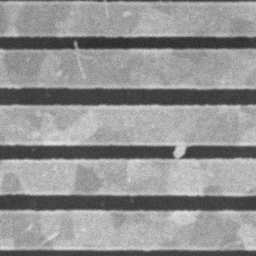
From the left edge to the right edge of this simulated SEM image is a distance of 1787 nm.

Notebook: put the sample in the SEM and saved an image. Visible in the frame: lines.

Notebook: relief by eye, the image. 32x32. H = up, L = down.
HHHHHHHHHHHHHHHHHHHHHHHHHHHHHHHH
HHHHHHHHHHHHHHHHHHHHHHHHHHHHHHHH
HHHHHHHHHHHHHHHHHHHHHHHHHHHHHHHH
HHHHHHHHHHHHHHHHHHHHHHHHHHHHHHHH
LLLLLLLLLLLLLLLLLLLLLLLLLLLLLLLL
LLLLLLLLLLLLLLLLLLLLLLLLLLLLLLLL
HHHHHHHHHHHHHHHHHHHHHHHHHHHHHHHH
HHHHHHHHHHHHHHHHHHHHHHHHHHHHHHHH
HHHHHHHHHHHHHHHHHHHHHHHHHHHHHHHH
HHHHHHHHHHHHHHHHHHHHHHHHHHHHHHHH
HHHHHHHHHHHHHHHHHHHHHHHHHHHHHHHH
LLLLLLLLLLLLLLLLLLLLLLLLLLLLLLLL
LLLLLLLLLLLLLLLLLLLLLLLLLLLLLLLL
HHHHHHHHHHHHHHHHHHHHHHHHHHHHHHHH
HHHHHHHHHHHHHHHHHHHHHHHHHHHHHHHH
HHHHHHHHHHHHHHHHHHHHHHHHHHHHHHHH
HHHHHHHHHHHHHHHHHHHHHHHHHHHHHHHH
HHHHHHHHHHHHHHHHHHHHHHHHHHHHHHHH
LLLLLLLLLLLLLLLLLLLLLLHLLLLLLLLL
LLLLLLLLLLLLLLLLLLLLLLLLLLLLLLLL
HHHHHHHHHHHHHHHHHHHHHHHHHHHHHHHH
HHHHHHHHHHHHHHHHHHHHHHHHHHHHHHHH
HHHHHHHHHHHHHHHHHHHHHHHHHHHHHHHH
HHHHHHHHHHHHHHHHHHHHHHHHHHHHHHHH
LLLLLLLLLLLLLLLLLLLLLLLLLLLLLLLL
LLLLLLLLLLLLLLLLLLLLLLLLLLLLLLLL
HHHHHHHHHHHHHHHHHHHHLHLHHLHLHHLL
HHHHHHHHHHHHHHHHHHHHHHHHHHHHHHHH
HHHHHHHHHHHHHHHHHHHHHHHHHHHHHHHH
HHHHHHHHHHHHHHHHHHHHHHHHHHHHHHHH
HHHHHHHHHHHHHHHHHHHHHHHHHHHHHHHH
LLLLLLLLLLLLLLLLLLLLLLLLLLLLLLLL